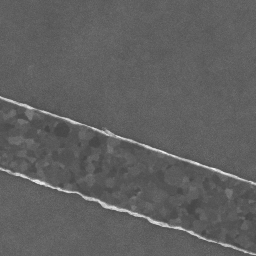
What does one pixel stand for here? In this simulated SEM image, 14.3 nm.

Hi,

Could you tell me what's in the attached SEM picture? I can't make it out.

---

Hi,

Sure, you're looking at one or a few lines or trenches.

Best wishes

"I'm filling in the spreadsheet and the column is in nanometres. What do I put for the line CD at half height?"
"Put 978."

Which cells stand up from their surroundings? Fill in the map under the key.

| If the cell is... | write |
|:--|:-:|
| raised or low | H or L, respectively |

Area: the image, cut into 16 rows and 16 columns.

LLLLLLLLLLLLLLLL
LLLLLLLLLLLLLLLL
LLLLLLLLLLLLLLLL
LLLLLLLLLLLLLLLL
LLLLLLLLLLLLLLLL
LLLLLLLLLLLLLLLL
HLLLLLLLLLLLLLLL
HHHHLLLLLLLLLLLL
HHHHHHHLLLLLLLLL
HHHHHHHHHHLLLLLL
HHHHHHHHHHHHHLLL
LLLHHHHHHHHHHHHH
LLLLLLHHHHHHHHHH
LLLLLLLLLHHHHHHH
LLLLLLLLLLLLHHHH
LLLLLLLLLLLLLLLH